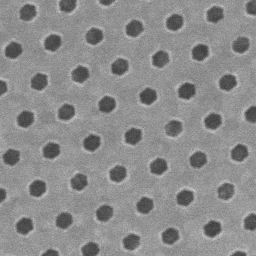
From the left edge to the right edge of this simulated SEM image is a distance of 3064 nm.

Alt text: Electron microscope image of a regular array of holes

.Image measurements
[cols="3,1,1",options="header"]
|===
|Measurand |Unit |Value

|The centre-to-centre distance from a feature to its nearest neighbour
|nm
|477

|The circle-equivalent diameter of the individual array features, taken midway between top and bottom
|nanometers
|228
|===